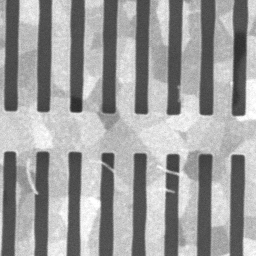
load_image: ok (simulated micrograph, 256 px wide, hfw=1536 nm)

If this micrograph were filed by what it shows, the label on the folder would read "groups of lines, slits or small figures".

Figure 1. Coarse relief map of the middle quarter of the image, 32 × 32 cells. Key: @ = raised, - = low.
@----@@@@----@@@@@---@@@@@---@@@
@----@@@@----@@@@@---@@@@@---@@@
@----@@@@----@@@@@---@@@@@---@@@
@----@@@@----@@@@@---@@@@@---@@@
@----@@@@----@@@@@---@@@@@---@@@
@----@@@@----@@@@@---@@@@@---@@@
@----@@@@----@@@@----@@@@@---@@@
@----@@@@----@@@@----@@@@@---@@@
@----@@@@----@@@@----@@@@@---@@@
@----@@@@----@@@@----@@@@@---@@@
@----@@@@----@@@@----@@@@@---@@@
@----@@@@----@@@@----@@@@@---@@@
@@@@@@@@@@--@@@@@@---@@@@@---@@@
@@@@@@@@@@@@@@@@@@@@@@@@@@@@@@@@
@@@@@@@@@@@@@@@@@@@@@@@@@@@@@@@@
@@@@@@@@@@@@@@@@@@@@@@@@@@@@@@@@
@@@@@@@@@@@@@@@@@@@@@@@@@@@@@@@@
@@@@@@@@@@@@@@@@@@@@@@@@@@@@@@@@
@@@@@@@@@@@@@@@@@@@@@@@@@@@@@@@@
@@@@@@@@@@@@@@@@@@@@@@@@@@@@@@@@
@@@@@@@@@@@@@@@@@@@@@@@@@@@@@@@@
@@@@@@@@@@@@@@@@@@@@@@@@@@@@@@@@
@----@@@@----@@@@----@@@@@---@@@
@----@@@@----@@@@----@@@@----@@@
@----@@@@@---@@@@----@@@@----@@@
@----@@@@----@@@@----@@@@----@@@
@----@@@@---@@@@@----@@@@@---@@@
@----@@@@----@@@@----@@@@---@@@@
@----@@@@----@@@@----@@@@----@@@
@----@@@@----@@@@----@@@@----@@@
@----@@@@----@@@@----@@@@----@@@
@----@@@@----@@@@----@@@@@---@@@